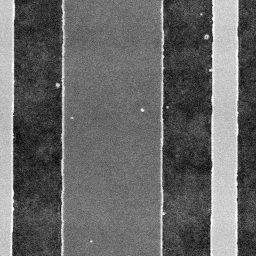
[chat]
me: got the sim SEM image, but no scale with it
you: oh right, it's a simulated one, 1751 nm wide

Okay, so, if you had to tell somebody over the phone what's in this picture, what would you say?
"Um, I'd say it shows lines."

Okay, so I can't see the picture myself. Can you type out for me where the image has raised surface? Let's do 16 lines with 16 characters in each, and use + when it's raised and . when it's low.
+...++++++...++.
+...++++++...++.
+...++++++...++.
+...++++++...++.
+...++++++...++.
+...++++++...++.
+...++++++...++.
+...++++++...++.
+...++++++...++.
+...++++++...++.
+...++++++...++.
+...++++++...++.
+...++++++...++.
+...++++++...++.
+...++++++...++.
+...++++++...++.